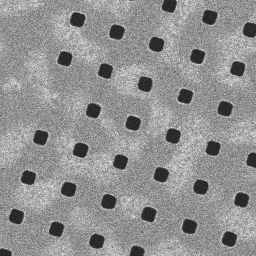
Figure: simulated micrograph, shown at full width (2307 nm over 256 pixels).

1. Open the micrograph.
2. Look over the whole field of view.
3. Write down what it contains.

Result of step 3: a regular array of holes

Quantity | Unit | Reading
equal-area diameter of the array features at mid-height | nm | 138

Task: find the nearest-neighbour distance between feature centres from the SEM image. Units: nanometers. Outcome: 369